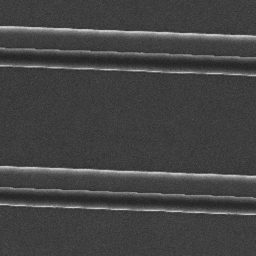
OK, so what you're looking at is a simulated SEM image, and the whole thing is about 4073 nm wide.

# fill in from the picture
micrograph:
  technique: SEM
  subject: lines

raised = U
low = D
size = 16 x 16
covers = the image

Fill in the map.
DDDDDDDDDDDDDDDD
DDDDDDDDDDDDDDDD
UUUUUUUUUUUUUUUU
UUUUUUUUUUUUUUUU
DDDDDDDDDDDDUUUU
DDDDDDDDDDDDDDDD
DDDDDDDDDDDDDDDD
DDDDDDDDDDDDDDDD
DDDDDDDDDDDDDDDD
DDDDDDDDDDDDDDDD
UUDDDDDDDDDDDDDD
UUUUUUUUUUUUUUUU
UUUUUUUUUUUUUUUU
DDDDDDDDDDDDDDDD
DDDDDDDDDDDDDDDD
DDDDDDDDDDDDDDDD